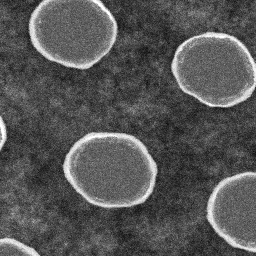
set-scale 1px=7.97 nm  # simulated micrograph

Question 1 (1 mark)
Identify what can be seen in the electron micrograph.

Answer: raised bodies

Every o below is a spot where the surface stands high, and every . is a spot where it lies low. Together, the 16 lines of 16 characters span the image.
..ooooo.........
..ooooo.........
..ooooo.....ooo.
...ooo.....ooooo
...........ooooo
...........ooooo
.............oo.
................
......oo........
....ooooo.......
....oooooo......
.....ooooo....oo
......ooo....ooo
.............ooo
..............oo
oo.............o